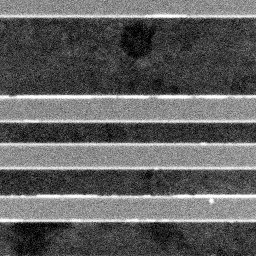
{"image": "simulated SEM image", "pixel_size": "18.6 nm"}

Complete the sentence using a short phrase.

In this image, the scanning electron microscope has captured lines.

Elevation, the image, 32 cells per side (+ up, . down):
++++++++++++++++++++++++++++++++
++++++++++++++++++++++++++++++++
................................
................................
................................
................................
................................
................................
................................
................................
................................
................................
++++++++++++++++++++++++++++++++
++++++++++++++++++++++++++++++++
++++++++++++++++++++++++++++++++
................................
................................
................................
++++++++++++++++++++++++++++++++
++++++++++++++++++++++++++++++++
++++++++++++++++++++++++++++++++
................................
................................
................................
.........................+++++++
++++++++++++++++++++++++++++++++
++++++++++++++++++++++++++++++++
++++++++++++++++++++++++++++++++
................................
................................
................................
................................